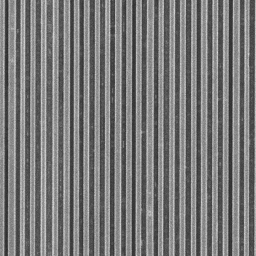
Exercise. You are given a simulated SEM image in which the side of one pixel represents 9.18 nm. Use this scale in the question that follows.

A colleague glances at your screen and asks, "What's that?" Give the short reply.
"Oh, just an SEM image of parallel lines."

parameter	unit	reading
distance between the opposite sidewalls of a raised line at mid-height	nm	50.5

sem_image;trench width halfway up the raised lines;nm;50.5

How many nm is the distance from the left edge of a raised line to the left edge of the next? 98.1